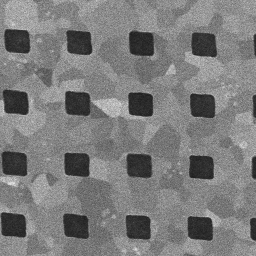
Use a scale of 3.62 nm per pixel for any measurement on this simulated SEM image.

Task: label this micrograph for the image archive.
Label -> a regular array of holes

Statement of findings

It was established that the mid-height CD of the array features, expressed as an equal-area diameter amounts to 97.4 nanometres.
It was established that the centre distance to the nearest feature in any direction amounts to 220 nanometers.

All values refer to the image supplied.